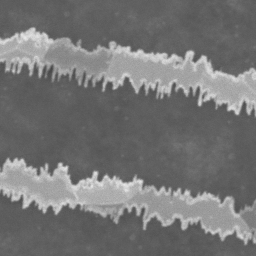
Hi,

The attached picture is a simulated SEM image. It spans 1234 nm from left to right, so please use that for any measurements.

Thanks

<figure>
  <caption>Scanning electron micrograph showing one or a few lines or trenches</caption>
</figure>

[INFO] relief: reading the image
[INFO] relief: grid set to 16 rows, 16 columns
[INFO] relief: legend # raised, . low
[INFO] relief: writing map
................
................
####............
#########.......
...##########..#
.........#######
..............##
................
................
................
##..............
#########.......
.#############..
.........#######
.............###
................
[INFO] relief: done